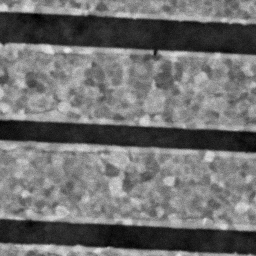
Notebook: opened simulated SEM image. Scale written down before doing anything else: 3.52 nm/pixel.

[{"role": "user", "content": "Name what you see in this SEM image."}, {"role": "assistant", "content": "one or a few lines or trenches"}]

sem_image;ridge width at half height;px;72.9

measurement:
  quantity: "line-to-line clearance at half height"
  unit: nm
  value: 101